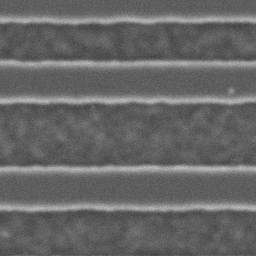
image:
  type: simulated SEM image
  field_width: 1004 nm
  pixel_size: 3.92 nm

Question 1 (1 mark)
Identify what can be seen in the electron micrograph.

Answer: lines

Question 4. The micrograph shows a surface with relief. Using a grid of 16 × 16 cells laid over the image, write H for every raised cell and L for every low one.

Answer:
HHHHHHHHHHHHHHHH
LLLLLLLLLLLLLLLL
LLLLLLLLLLLLLLLL
LLLLLLLLLLLLLLLL
HHHHHHHHHHHHHHHH
HHHHHHHHHHHHHHHH
LLLLLLLLLLLLLLLL
LLLLLLLLLLLLLLLL
LLLLLLLLLLLLLLLL
LLLLLLLLLLLLLLLL
HHHHHHHHHHHHHHHH
HHHHHHHHHHHHHHHH
HHHHHHHHHHHHHHHH
LLLLLLLLLLLLLLLL
LLLLLLLLLLLLLLLL
LLLLLLLLLLLLLLLL